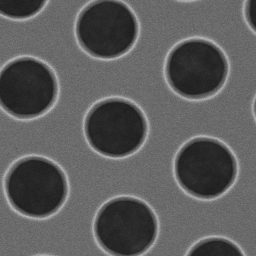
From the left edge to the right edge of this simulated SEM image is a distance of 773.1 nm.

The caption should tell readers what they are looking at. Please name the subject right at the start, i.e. holes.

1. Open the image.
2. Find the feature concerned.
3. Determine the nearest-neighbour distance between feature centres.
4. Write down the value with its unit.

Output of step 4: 0.298 micrometres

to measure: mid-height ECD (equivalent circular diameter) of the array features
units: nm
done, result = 178